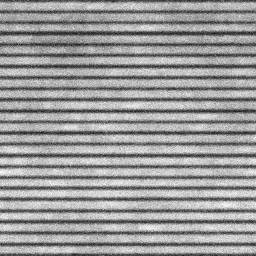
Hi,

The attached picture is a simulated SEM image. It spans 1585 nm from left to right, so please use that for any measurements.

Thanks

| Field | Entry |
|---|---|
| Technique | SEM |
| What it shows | parallel lines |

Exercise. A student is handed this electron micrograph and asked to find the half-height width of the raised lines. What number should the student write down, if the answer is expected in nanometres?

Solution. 43.3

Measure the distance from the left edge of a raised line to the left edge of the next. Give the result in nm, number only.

68.4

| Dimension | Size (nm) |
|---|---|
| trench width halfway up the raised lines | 24.7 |